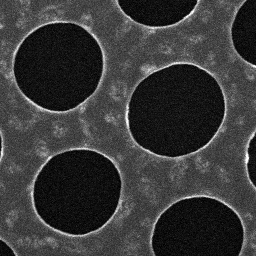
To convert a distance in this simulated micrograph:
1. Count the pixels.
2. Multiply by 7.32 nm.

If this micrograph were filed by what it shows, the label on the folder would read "holes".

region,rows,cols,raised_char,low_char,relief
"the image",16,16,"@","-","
@@@@@@@@----@@@-
@@@--@@@@--@@@@-
@@----@@@@@@@@@-
@-----@@@@@@@@@-
@-----@@@@---@@@
@-----@@@-----@@
@@---@@@------@@
@@@@@@@@------@@
@@@@@@@@-----@@@
@@@@--@@@---@@@@
@@@----@@@@@@@@-
@@------@@@@@@@@
@@-----@@@@---@@
@@-----@@@-----@
@@@@--@@@@-----@
-@@@@@@@@@-----@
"